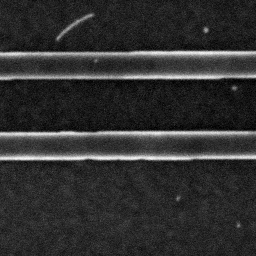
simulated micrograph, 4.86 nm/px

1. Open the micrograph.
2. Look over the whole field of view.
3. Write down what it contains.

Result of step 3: lines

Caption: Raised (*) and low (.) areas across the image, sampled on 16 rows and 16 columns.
................
................
................
****************
****************
................
................
................
****************
****************
................
................
................
................
................
................